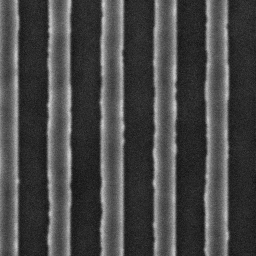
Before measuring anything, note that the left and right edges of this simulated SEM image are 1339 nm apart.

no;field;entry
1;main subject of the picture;lines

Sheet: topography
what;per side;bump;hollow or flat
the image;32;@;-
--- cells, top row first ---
@@----@@@----@@----@@@----@@----
@@----@@@----@@----@@@----@@----
@@----@@@----@@----@@@----@@----
@@----@@@----@@----@@@----@@----
@@----@@@----@@----@@@----@@----
@@----@@@----@@----@@@----@@----
@@----@@@----@@----@@@----@@----
@@----@@@----@@----@@@----@@----
@@----@@@----@@----@@@----@@----
@@----@@@----@@----@@@----@@----
@@----@@@----@@----@@@----@@----
@@----@@@----@@----@@@----@@----
@@----@@@----@@----@@@----@@----
@@----@@@----@@----@@@----@@----
@@----@@@----@@----@@@----@@----
@@----@@@----@@----@@@----@@----
@@----@@@----@@----@@@----@@----
@@----@@@----@@----@@@----@@----
@@----@@@----@@----@@@----@@----
@@----@@@----@@----@@@----@@----
@@----@@@----@@----@@@----@@----
@@----@@@----@@----@@@----@@----
@@----@@@----@@----@@@----@@----
@@----@@@----@@----@@@----@@----
@@----@@@----@@----@@@----@@----
@@----@@@----@@----@@@----@@----
@@----@@@----@@----@@@----@@----
@@----@@@----@@----@@@----@@----
@@----@@@----@@----@@@----@@----
@@----@@@----@@----@@@----@@----
@@----@@@----@@----@@@----@@----
@@----@@@----@@----@@@----@@----